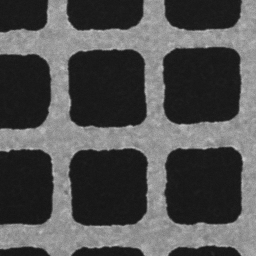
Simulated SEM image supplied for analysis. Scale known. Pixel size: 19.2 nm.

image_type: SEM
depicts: holes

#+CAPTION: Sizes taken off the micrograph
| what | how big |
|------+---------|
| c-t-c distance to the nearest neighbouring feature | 1830 nm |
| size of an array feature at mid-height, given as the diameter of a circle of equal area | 1640 nm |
